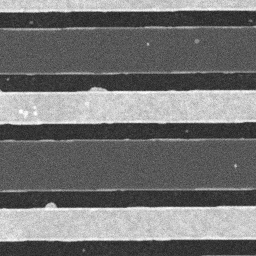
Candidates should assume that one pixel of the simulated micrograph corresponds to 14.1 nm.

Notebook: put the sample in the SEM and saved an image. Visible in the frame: lines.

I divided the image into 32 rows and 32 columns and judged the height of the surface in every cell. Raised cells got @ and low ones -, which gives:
@@@@@@@@@@@@@@@@@@@@@@@@@@@@@@@@
--------------------------------
--------------------------------
------------------@@@@@@@@@@@@@@
@@@@@@@@@@@@@@@@@@@@@@@@@@@@@@@@
@@@@@@@@@@@@@@@@@@@@@@@@@@@@@@@@
@@@@@@@@@@@@@@@@@@@@@@@@@@@@@@@@
@@@@@@@@@@@@@@@@@@@@@@@@@@@@@@@@
@@@@@@@@@@@@@@@@@@@@@@@@@@@@@@@@
--------------------------------
--------------------------------
----------@@-@@@@@@@@@@@@@@@@@@@
@@@@@@@@@@@@@@@@@@@@@@@@@@@@@@@@
@@@@@@@@@@@@@@@@@@@@@@@@@@@@@@@@
@@@@@@@@@@@@@@@@@@@@@@@@@@@@@@@@
--@-----------------------------
--------------------------------
---------------@--@@@@@@@@@@@@@@
@@@@@@@@@@@@@@@@@@@@@@@@@@@@@@@@
@@@@@@@@@@@@@@@@@@@@@@@@@@@@@@@@
@@@@@@@@@@@@@@@@@@@@@@@@@@@@@@@@
@@@@@@@@@@@@@@@@@@@@@@@@@@@@@@@@
@@@@@@@@@@@@@@@@@@@@@@@@@@@@@@@@
@@@@@@@@@@@@@@@@@@@@@@@@@@@@@@@@
--------------------------------
--------------------------------
@@@@@@@@@@@@@@@@@@@@@@@@@@@@@@@@
@@@@@@@@@@@@@@@@@@@@@@@@@@@@@@@@
@@@@@@@@@@@@@@@@@@@@@@@@@@@@@@@@
@@@@@@@@@@@@@@@@@@@@@@@@@@@@@@@@
--------------------------------
--------------------------------